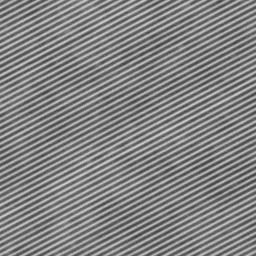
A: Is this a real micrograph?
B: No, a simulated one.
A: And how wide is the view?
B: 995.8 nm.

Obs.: parallel lines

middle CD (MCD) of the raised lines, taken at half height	1.67	pixels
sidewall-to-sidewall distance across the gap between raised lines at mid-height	0.0164	microns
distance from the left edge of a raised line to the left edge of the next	21.3	nanometres